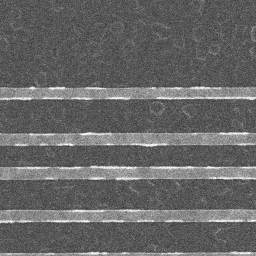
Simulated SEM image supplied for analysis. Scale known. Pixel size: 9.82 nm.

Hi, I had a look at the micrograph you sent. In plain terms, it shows parallel lines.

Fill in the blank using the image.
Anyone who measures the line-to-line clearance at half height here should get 306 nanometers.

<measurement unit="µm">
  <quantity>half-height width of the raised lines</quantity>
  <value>0.117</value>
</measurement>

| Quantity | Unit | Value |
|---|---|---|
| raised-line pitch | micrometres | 0.399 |